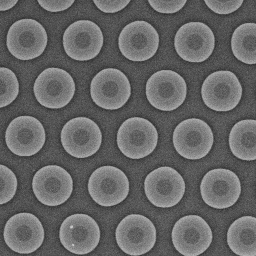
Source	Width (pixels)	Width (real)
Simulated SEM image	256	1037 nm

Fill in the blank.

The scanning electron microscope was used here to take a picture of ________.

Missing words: an array of small figures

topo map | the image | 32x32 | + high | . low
++...++++...++++...++++...++++..
.............+......++.....++...
...+............................
.++++...++++....+++....+++....++
.+++++..+++++..+++++..+++++..+++
.+++++..+++++..+++++..+++++..+++
.++++...++++...++++...+++++..+++
..........+.....++.....+++....++
+.....+.........................
++...++++...++++...++++...+++...
++..+++++..+++++..+++++..+++++..
++..+++++..+++++..+++++..+++++..
++...++++...++++...++++..+++++..
......+......++.....++....+++...
................................
.++++...++++...++++...++++....++
.+++++..+++++..+++++..++++...+++
.+++++..+++++..+++++..+++++..+++
.++++...++++...++++...++++...+++
.........++.....++.....+++...+++
................................
++...+++....+++....+++....+++...
++..+++++..+++++..+++++..+++++..
++..+++++..+++++..+++++..+++++..
++..+++++..+++++..+++++..+++++..
......++....+++....+++....+++...
................................
.++++...++++...++++...+++.....++
.++++...++++...++++...++++...+++
+++++..+++++..+++++...++++..++++
.++++...++++...++++...++++...+++
..++.....++.....++....+++....+++